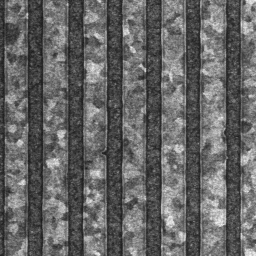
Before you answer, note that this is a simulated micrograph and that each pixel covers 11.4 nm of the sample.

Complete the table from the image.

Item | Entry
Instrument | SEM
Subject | parallel lines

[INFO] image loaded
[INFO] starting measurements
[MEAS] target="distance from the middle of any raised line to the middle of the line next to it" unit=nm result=449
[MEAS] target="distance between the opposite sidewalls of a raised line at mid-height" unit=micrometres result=0.258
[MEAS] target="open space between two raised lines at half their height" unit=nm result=185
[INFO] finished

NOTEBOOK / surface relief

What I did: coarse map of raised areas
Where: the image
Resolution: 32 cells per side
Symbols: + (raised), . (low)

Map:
.++..+++...++..+++..+++..+++..++
.++..+++..+++..+++..+++..+++..++
.++..+++..+++..+++..+++..+++..++
.++..+++..+++..+++..+++..+++..++
.++..+++...++..+++..+++..+++..++
.++..+++...++..+++..+++..+++..++
.++..+++...++..+++..+++..+++..++
.++..+++...++..+++..+++..+++..++
.++..+++...++..+++..+++..+++..++
.++..+++...++..+++..+++..+++..++
.++..+++...++..+++..+++..+++..++
.++..+++...++..+++..+++..+++..++
.++..+++...++..+++..+++..+++..++
.++..+++..+++..+++..+++..+++..++
.++..+++...++..+++..+++..+++..++
.++..++++..++..+++..+++..+++..++
.++..++++..++..+++..+++..+++..++
.++..+++...++..+++..+++..+++..++
.++..+++...++..+++..+++..+++..++
.++..+++...++..+++..+++..+++..++
.++..+++...++..+++..+++..+++..++
.++..+++...++..+++..+++..+++..++
.++..+++...++..+++..+++..+++..++
.++..+++...++..+++..+++..+++..++
.++..+++...++..+++..+++..+++..++
.++..+++...++..+++..+++..+++..++
.++..+++..+++..+++..+++..+++..++
.++..+++..+++..+++..+++..+++..++
.++..+++..+++..+++..+++..+++..++
.++..+++...++..+++..+++..+++..++
.++..+++...++..+++..+++..+++..++
.++..+++...++..+++..+++..+++..++